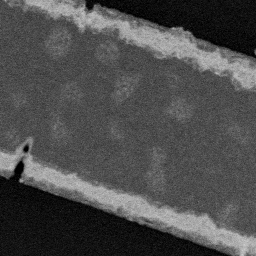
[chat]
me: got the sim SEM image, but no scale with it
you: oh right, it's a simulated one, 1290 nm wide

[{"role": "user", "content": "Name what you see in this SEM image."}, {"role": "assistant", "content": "one or a few lines or trenches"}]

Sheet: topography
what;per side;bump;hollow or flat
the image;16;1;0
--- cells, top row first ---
1111000000000000
1111111100000000
1111111111000000
1111111111110000
1111111111111110
1111111111111111
1111111111111111
1111111111111111
1111111111111111
1111111111111111
0011111111111111
0000011111111111
0000000011111111
0000000000111111
0000000000000011
0000000000000000